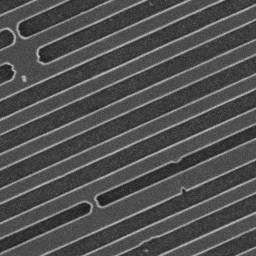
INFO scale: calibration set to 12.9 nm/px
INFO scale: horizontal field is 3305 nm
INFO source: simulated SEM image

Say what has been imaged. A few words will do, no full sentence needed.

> parallel lines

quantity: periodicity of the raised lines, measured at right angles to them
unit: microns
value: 0.406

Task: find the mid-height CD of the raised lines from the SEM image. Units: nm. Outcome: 190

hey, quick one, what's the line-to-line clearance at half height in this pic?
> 224 nanometers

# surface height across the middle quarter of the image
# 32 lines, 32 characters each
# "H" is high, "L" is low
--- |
HHHLLLLLLLLLLLHHHHHHHHLLLLLLLLLL
HLLLLLLLLLLLHHHHHHHHLLLLLLLLLLLH
LLLLLLLLLLHHHHHHHHLLLLLLLLLLLHHH
LLLLLLLLHHHHHHHHLLLLLLLLLLLHHHHH
LLLLLHHHHHHHHHLLLLLLLLLLHHHHHHHH
LLLHHHHHHHHLLLLLLLLLLLHHHHHHHHLL
HHHHHHHHHLLLLLLLLLLLHHHHHHHHLLLL
HHHHHHHLLLLLLLLLLLHHHHHHHHLLLLLL
HHHHHLLLLLLLLLLHHHHHHHHHLLLLLLLL
HHLLLLLLLLLLLHHHHHHHHLLLLLLLLLLL
LLLLLLLLLLLHHHHHHHHLLLLLLLLLLLHH
LLLLLLLLLHHHHHHHHLLLLLLLLLLLHHHH
LLLLLLLHHHHHHHHLLLLLLLLLLLHHHHHH
LLLLHHHHHHHHHLLLLLLLLLLHHHHHHHHH
LLHHHHHHHHLLLLLLLLLLLHHHHHHHHHLL
HHHHHHHHLLLLLLLLLLLHHHHHHHHHLLLL
HHHHHHLLLLLLLLLLLHHHHHHHHLLLLLLL
HHHHLLLLLLLLLLHHHHHHHHHLLLLLLLLL
HLLLLLLLLLLLHHHHHHHHHLLLLLLLLLLH
LLLLLLLLLLHHHHHHHHLLLLLLLLLLLHHH
LLLLLLLLHHHHHHHHLLLLLLLLLLLHHHHH
LLLLLLHHHHHHHHLLLLLLLLLLLHHHHHHH
LLLHHHHHHHHHLLLLLLLLLLHHHHHHHHHL
LHHHHHHHHLLLLLLLLLLLHHHHHHHHHLLL
HHHHHHHLLLLLLLLLLLHHHHHHHHHLLLLL
HHHHHLLLLLLLLLLLHHHHHHHHHLLLLLLL
HHHLLLLLLLLLLLHHHHHHHHLLLLLLLLHH
HLLLLLLLLLLHHHHHHHHHLLLLLLLLLHHH
LLLLLLLLLHHHHHHHHHLLLLLLLLHHHHHH
LLLLLLLHHHHHHHHHLLLLLLLLHHHHHHHH
LLLLLHHHHHHHHLLLLLLLLLHHHHHHHHHH
LLHHHHHHHHHLLLLLLLLHHHHHHHHHHLHL